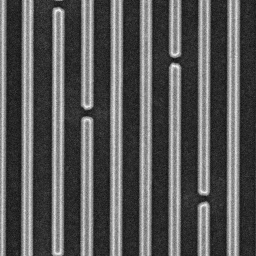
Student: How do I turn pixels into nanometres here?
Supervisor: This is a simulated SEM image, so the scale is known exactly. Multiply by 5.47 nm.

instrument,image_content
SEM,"parallel lines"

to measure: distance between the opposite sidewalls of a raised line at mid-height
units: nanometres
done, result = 45.8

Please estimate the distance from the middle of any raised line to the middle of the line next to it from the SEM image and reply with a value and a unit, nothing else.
0.161 um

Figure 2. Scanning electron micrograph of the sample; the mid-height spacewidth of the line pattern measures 20.3 px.